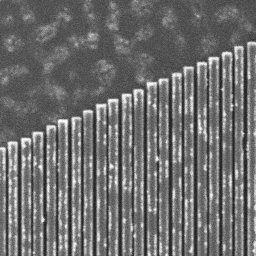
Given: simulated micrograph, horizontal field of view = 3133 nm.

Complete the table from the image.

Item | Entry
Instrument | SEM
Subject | parallel lines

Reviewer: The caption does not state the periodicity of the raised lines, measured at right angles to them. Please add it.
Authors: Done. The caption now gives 153 nm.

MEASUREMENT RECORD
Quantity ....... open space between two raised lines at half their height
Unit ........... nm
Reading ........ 45.9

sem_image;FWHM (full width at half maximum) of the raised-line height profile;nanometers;116